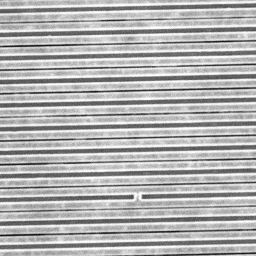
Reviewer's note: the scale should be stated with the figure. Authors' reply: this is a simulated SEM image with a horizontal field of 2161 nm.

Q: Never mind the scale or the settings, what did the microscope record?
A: parallel lines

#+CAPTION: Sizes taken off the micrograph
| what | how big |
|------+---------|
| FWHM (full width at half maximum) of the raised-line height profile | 8.25 pixels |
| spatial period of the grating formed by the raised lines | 11.8 pixels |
